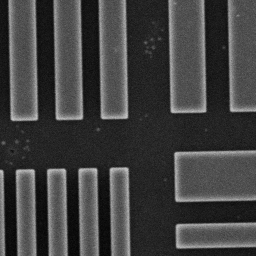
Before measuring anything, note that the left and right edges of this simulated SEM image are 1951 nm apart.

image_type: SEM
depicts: groups of lines, slits or small figures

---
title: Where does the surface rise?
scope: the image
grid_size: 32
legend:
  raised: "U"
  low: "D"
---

DUUUDDDUUUDDUUUUDDDDDUUUUDDDDUUU
DUUUDDDUUUDDUUUUDDDDDUUUUDDDDUUU
DUUUDDDUUUDDUUUUDDDDDUUUUDDDDUUU
DUUUDDDUUUDDUUUUDDDDDUUUUDDDDUUU
DUUUDDDUUUDDUUUUDDDDDUUUUUDDDUUU
DUUUDDDUUUDDUUUUDDDDDUUUUUDDDUUU
DUUUDDDUUUDDDUUUDDDDDUUUUUDDDUUU
DUUUDDDUUUDDDUUUDDDDDUUUUUDDDUUU
DUUUUDDUUUDDDUUUDDDDDUUUUUDDDUUU
DUUUUDDUUUDDDUUUDDDDDUUUUUDDDUUU
DUUUUDDUUUDDDUUUDDDDDUUUUUDDDUUU
DUUUUDDUUUDDDUUUDDDDDUUUUUDDDUUU
DUUUUDDUUUDDDUUUDDDDDUUUUUDDDUUU
DUUUUDDUUUDDDUUUDDDDDUUUUUDDDUUU
DUUUUDDUUUDDDUUUDDDDDDDDDDDDDDDD
DDDDDDDDDDDDDDDDDDDDDDDDDDDDDDDD
DDDDDDDDDDDDDDDDDDDDDDDDDDDDDDDD
DDDDDDDDDDDDDDDDDDDDDDDDDDDDDDDD
DDDDDDDDDDDDDDDDDDDDDDDDDDDDDDDD
DDDDDDDDDDDDDDDDDDDDDDUUUUUUUUUU
DDDDDDDDDDDDDDDDDDDDDDUUUUUUUUUU
DDUUDDUUDDUUDDUUDDDDDDUUUUUUUUUU
DDUUDDUUDDUUDDUUDDDDDDUUUUUUUUUU
DDUUDDUUDDUUDDUUDDDDDDUUUUUUUUUU
DDUUDDUUDDUUDDUUDDDDDDUUUUUUUUUU
DDUUDDUUDDUUDDUUDDDDDDDDDDDDDDDD
DDUUDDUUDDUUDDUUDDDDDDDDDDDDDDDD
DDUUDDUUDDUUDDUUDDDDDDDDDDDDDDDD
DDUUDDUUDDUUDDUUDDDDDDUUUUUUUUUU
UDUUDDUUDDUUDDUUDDDDDDUUUUUUUUUU
UDUUDDUUDDUUDDUUDDDDDDUUUUUUUUUU
UDUUDDUUDDUUDDUUDDDDDDDDDDDDDDDD